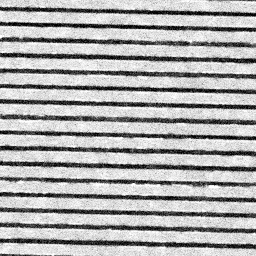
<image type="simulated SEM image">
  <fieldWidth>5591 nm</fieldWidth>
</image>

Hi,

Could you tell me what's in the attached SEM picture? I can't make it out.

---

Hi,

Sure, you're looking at parallel lines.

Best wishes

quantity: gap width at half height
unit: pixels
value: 4.87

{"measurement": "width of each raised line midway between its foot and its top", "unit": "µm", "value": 0.235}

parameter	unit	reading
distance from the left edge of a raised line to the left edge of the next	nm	337